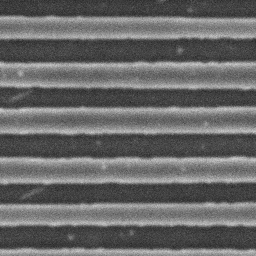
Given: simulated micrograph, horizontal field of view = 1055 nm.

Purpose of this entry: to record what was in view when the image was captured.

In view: lines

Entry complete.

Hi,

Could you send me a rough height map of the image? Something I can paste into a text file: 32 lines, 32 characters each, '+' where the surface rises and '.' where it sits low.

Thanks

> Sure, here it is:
................................
................................
++++++++++++++++++++++++++++++++
++++++++++++++++++++++++++++++++
++++++++++++++++++++++++++++++++
................................
................................
................................
++++++++++++++++++++++++++++++++
++++++++++++++++++++++++++++++++
++++++++++++++++++++++++++++++++
................................
................................
..........+..........++..+.+++++
++++++++++++++++++++++++++++++++
++++++++++++++++++++++++++++++++
++++++++++++++++++++++++++++++++
................................
................................
................................
++++++++++++++++++++++++++++++++
++++++++++++++++++++++++++++++++
++++++++++++++++++++++++++++++++
................................
................................
.........................++++.++
++++++++++++++++++++++++++++++++
++++++++++++++++++++++++++++++++
................................
................................
................................
++++++++++++++++++++++++++++++++